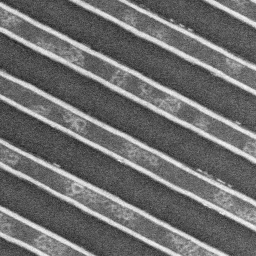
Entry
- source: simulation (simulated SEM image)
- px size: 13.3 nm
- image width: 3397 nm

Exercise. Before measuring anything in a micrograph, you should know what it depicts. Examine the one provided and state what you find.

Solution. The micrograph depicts parallel lines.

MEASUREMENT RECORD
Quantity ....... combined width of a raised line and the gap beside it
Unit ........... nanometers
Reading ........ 801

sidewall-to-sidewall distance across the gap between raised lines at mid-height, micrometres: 0.519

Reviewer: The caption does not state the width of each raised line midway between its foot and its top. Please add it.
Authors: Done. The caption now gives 288 nm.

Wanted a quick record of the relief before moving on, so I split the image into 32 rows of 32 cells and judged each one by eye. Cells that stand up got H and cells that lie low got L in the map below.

LLLLLLLLLLHHHHHHLLLLLLLLLLLHHHHH
HHLLLLLLLLLLHHHHHHLLLLLLLLLLLHHH
HHHHLLLLLLLLLLHHHHHHLLLLLLLLLLLH
HHHHHHLLLLLLLLLLHHHHHHLLLLLLLLLL
LLHHHHHHLLLLLLLLLLHHHHHHLLLLLLLL
LLLLHHHHHHLLLLLLLLLLHHHHHHLLLLLL
LLLLLLHHHHHLLLLLLLLLLLHHHHHHLLLL
LLLLLLLLHHHHHHLLLLLLLLLLHHHHHHLL
LLLLLLLLLLHHHHHHLLLLLLLLLLHHHHHH
HLLLLLLLLLLLHHHHHLLLLLLLLLLLHHHH
HHHLLLLLLLLLLHHHHHHLLLLLLLLLLLHH
HHHHHLLLLLLLLLLHHHHHHLLLLLLLLLLL
LHHHHHHLLLLLLLLLLHHHHHHLLLLLLLLL
LLLHHHHHHLLLLLLLLLLHHHHHHLLLLLLL
LLLLLHHHHHLLLLLLLLLLLHHHHHHLLLLL
LLLLLLLHHHHHLLLLLLLLLLLHHHHHHLLL
LLLLLLLLLHHHHHHLLLLLLLLLLHHHHHHL
LLLLLLLLLLLHHHHHLLLLLLLLLLLHHHHH
HHLLLLLLLLLLLHHHHHLLLLLLLLLLLHHH
HHHHLLLLLLLLLLLHHHHHLLLLLLLLLLLH
HHHHHLLLLLLLLLLLHHHHHHLLLLLLLLLL
LLHHHHHHLLLLLLLLLLHHHHHHLLLLLLLL
LLLLHHHHHHLLLLLLLLLLHHHHHHLLLLLL
LLLLLLHHHHHHLLLLLLLLLLHHHHHHLLLL
LLLLLLLLHHHHHLLLLLLLLLLLHHHHHHLL
LLLLLLLLLLHHHHHLLLLLLLLLLLHHHHHH
HLLLLLLLLLLHHHHHHHLLLLLLLLLLHHHH
HHHLLLLLLLLLLHHHHHHLLLLLLLLLLLHH
HHHHHLLLLLLLLLLHHHHHHLLLLLLLLLLL
LHHHHHHLLLLLLLLLLHHHHHHLLLLLLLLL
LLLHHHHHHLLLLLLLLLLHHHHHHLLLLLLL
LLLLLHHHHHLLLLLLLLLLLHHHHHHLLLLL